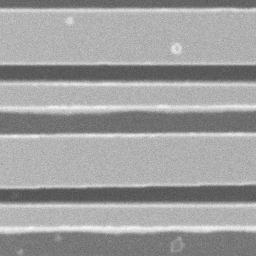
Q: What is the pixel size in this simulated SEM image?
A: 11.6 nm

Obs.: lines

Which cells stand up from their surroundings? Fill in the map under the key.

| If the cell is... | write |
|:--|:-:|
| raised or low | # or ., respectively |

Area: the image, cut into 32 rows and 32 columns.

................................
################################
################################
################################
################################
################################
################################
################################
................................
................................
################################
################################
################################
#############...................
................................
................................
................................
################################
################################
################################
################################
################################
################################
................................
................................
................................
################################
################################
####.##.....####.##.............
................................
................................
................................